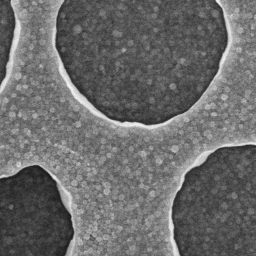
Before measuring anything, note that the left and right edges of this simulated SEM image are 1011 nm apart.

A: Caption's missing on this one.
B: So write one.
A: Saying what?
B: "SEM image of holes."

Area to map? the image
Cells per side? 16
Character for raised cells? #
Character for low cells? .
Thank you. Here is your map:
.###..........##
.###..........##
.##...........##
.###..........##
.###..........##
#####........###
######......####
#######....#####
################
#############...
##.#########....
....#######.....
....#######.....
....#######.....
.....######.....
....#######.....